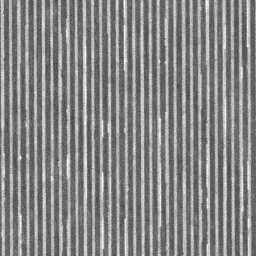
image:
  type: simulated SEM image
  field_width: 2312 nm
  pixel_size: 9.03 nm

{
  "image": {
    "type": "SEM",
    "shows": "parallel lines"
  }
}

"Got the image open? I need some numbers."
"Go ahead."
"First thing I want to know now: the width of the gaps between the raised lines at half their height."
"0.0508 um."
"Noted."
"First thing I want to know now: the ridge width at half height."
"0.0226 micrometres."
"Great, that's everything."